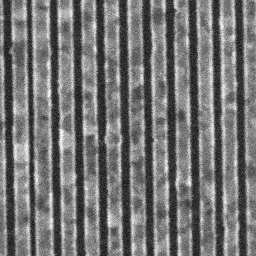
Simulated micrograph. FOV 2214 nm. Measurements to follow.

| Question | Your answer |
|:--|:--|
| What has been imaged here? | parallel lines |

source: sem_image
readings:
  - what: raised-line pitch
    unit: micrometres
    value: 0.201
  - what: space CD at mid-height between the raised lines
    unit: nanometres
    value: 90.8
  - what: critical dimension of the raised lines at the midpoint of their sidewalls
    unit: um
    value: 0.108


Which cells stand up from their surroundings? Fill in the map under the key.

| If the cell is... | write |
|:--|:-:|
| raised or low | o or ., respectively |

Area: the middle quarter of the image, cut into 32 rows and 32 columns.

oo...ooo...ooo...oo...ooo...ooo.
oo...ooo...ooo..oooo..ooo...ooo.
oo...ooo...ooo..oooo..ooo...ooo.
oo...ooo...ooo...ooo..ooo...ooo.
oo...ooo...ooo..oooo..ooo...ooo.
oo...ooo...ooo..oooo..oooo..ooo.
oo...ooo...ooo...ooo..oooo..ooo.
oo...ooo...ooo...ooo..oooo..ooo.
oo...ooo...ooo...ooo..ooo...ooo.
oo...ooo...ooo...ooo..ooo...ooo.
oo...ooo...ooo...ooo...oo...ooo.
oo...ooo...ooo...ooo...oo...ooo.
oo...ooo...ooo...ooo...oo...ooo.
oo...ooo...ooo...ooo...oo...ooo.
oo...ooo...ooo...ooo...oo...ooo.
oo...ooo...ooo...ooo...oo...ooo.
oo...ooo...ooo...ooo...oo...ooo.
ooo..ooo...ooo...ooo...oo...ooo.
ooo..ooo..oooo...ooo...ooo..ooo.
oo...ooo..oooo...ooo...ooo..ooo.
oo...ooo...ooo...ooo...ooo..ooo.
oo...ooo...ooo...ooo...ooo..oooo
oo...ooo...ooo...ooo...ooo..ooo.
oo...ooo...ooo...ooo...ooo..ooo.
oo...ooo...ooo...ooo...ooo..oooo
oo...ooo...ooo...ooo...ooo..oooo
oo...ooo...ooo...ooo...ooo...oo.
oo...ooo...ooo...ooo...ooo...oo.
ooo..ooo...ooo...ooo...ooo...oo.
ooo..ooo...ooo...ooo...ooo..oooo
ooo..ooo...ooo...ooo...ooo..oooo
ooo..ooo...ooo...ooo...ooo...oo.